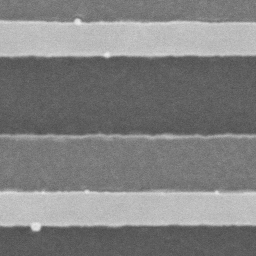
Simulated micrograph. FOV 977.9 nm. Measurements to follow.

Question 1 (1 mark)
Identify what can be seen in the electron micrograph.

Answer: lines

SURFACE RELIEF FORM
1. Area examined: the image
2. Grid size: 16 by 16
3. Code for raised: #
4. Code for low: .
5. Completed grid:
################
################
################
#..#..#..#......
................
................
................
................
................
################
################
################
################
################
................
................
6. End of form